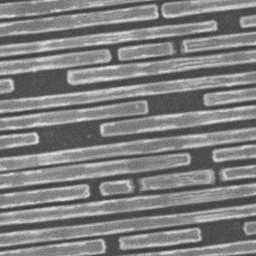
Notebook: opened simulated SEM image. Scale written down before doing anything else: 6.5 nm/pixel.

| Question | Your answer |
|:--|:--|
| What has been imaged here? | parallel lines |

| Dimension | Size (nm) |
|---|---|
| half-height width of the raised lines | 79.9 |